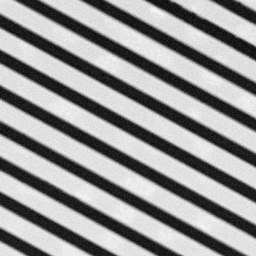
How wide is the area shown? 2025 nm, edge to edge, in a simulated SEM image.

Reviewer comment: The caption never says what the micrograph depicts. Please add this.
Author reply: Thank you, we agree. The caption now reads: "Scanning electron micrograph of parallel lines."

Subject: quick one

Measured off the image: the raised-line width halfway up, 135 nanometres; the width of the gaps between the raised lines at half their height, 0.108 microns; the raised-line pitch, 247 nanometres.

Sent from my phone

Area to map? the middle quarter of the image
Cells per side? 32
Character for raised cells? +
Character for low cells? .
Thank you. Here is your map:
+.......+++++++++........+++++++
+++.......+++++++++........+++++
+++++.......+++++++++.......++++
+++++++.......++++++++........++
++++++++........++++++++........
.+++++++++.......+++++++++......
...+++++++++.......+++++++++....
.....+++++++++.......+++++++++..
.......+++++++++.......+++++++++
+.......++++++++++.......+++++++
+++.......+++++++++........+++++
+++++.......+++++++++.......++++
+++++++.......+++++++++.......++
++++++++........+++++++++.......
.+++++++++........+++++++++.....
...+++++++++.......+++++++++....
.....+++++++++.......+++++++++..
.......+++++++++.......+++++++++
+........+++++++++.......+++++++
+++.......+++++++++........+++++
+++++.......+++++++++........+++
+++++++.......+++++++++.......++
+++++++++.......+++++++++.......
..++++++++........+++++++++.....
....++++++++........+++++++++...
.....+++++++++.......+++++++++..
.......+++++++++.......+++++++++
+........+++++++++.......+++++++
+++........+++++++++.......+++++
+++++........++++++++........+++
+++++++.......+++++++++........+
+++++++++.......+++++++++.......